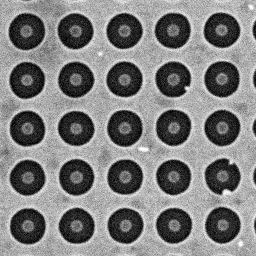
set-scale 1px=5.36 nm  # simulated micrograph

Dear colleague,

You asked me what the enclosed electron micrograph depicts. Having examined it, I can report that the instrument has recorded an array of small figures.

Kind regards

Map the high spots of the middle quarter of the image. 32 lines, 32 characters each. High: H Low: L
LLLLLLHHHHHHLLLLLLHHHHHHLLLLLLHH
LLLLLLLHHHHLLLLLLLLHHHHLLLLLLLLH
LLLLLLLHHHHLLLLLLLLLHHHLLLLLLLLL
LLHHLLLLHHLLLLHHLLLLHHHLLLHHHLLL
LLHHLLLLHHHLLLHHLLLLHHHLLLHHHLLL
LLLLLLLHHHHLLLLLLLLHHHHLLLLLLLLL
LLLLLLLHHHHLLLLLLLLHHHHHLLLLLLLH
LLLLLLHHHHHHLLLLLLHHHHHHHLLLLLHH
HHLLHHHHHHHHHHHHHHHHHHHHHHHLHHHH
HHHHHHHHHHHHHHHHHHHHHHHHHHHHHHHH
HHHHHHHHHHHHHHHHHHHHHHHHHHHHHHHH
HHHHHHHHHHHHHHLLHHHHHHHHHHLLLHHH
LLLLLLHHHHHHLLLLLLHHHHHHLLLLLLLH
LLLLLLLHHHHLLLLLLLLHHHHLLLLLLLLH
LLLLLLLHHHHLLLLLLLLHHHHLLLLLLLLL
LLHHLLLLHHHLLLHHLLLLHHHLLLHHHLLL
LLHHLLLLHHHLLLHHHLLLHHHLLLHHHLLL
LLLLLLLHHHHLLLLLLLLHHHHLLLLLLLLH
LLLLLLLHHHHLLLLLLLLHHHHHLLLLLLLH
LLLLLLHHHHHHLLLLLLHHHHHHHLLLLLHH
HHLLHHHHHHHHHHLLLHHHHLHHHHLLHHHH
HHHHHHHHHHHHHHHHHHHHHHHHLHHHHHHH
HHHHHHHHHHHHHHHHHHHHHHHHHHHHHHHH
HHHHHHHHHHHHHHHHHHHHHHHHHHHHHHHH
LLLLLLHHHHHHHLLLLLHHHHHHHLLLLLHH
LLLLLLLHHHHHLLLLLLLHHHHHLLLLLLLH
LLLLLLLHHHHLLLLLLLLLHHHLLLLLLLLL
LLHHLLLLHHHLLLHHHLLLHHHLLLHHLLLL
LLHHHLLLHHHLLLHHHLLLHHHLLLHHHLLL
LLHHLLLHHHHLLLLHLLLLHHHLLLLLLLLL
LLLLLLLHHHHLLLLLLLLHHHHHLLLLLLLH
LLLLLLHHHHHHLLLLLLLHHHHHLLLLLLLH